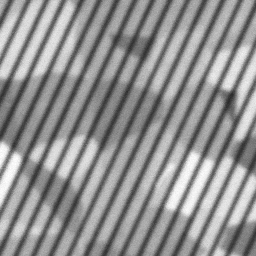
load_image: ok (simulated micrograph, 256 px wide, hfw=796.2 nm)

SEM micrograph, parallel lines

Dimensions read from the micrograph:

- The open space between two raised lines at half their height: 18.6 nanometres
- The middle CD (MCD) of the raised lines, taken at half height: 29.6 nm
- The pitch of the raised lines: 0.0497 micrometres